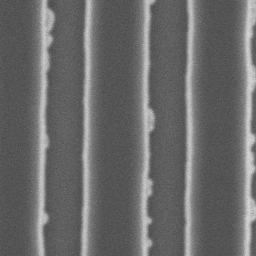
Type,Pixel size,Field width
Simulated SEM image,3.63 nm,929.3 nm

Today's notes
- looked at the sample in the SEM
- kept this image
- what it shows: lines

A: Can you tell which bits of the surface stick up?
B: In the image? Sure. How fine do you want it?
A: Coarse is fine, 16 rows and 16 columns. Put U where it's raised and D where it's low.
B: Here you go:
UUUDDUUUUDDDUUUU
UUUDDUUUUDDDUUUU
UUUDDUUUUDDDUUUU
UUUDDUUUUDDDUUUU
UUUDDUUUUDDDUUUU
UUUDDUUUUDDDUUUU
UUUDDUUUUDDDUUUU
UUUDDUUUUDDDUUUU
UUUDDUUUUDDDUUUU
UUUDDUUUUDDDUUUU
UUUDDUUUUDDDUUUU
UUUDDUUUUDDDUUUU
UUUDDUUUUDDDUUUU
UUUDDUUUUDDDUUUU
UUUDDUUUUDDDUUUU
UUUDDUUUUDDDUUUU